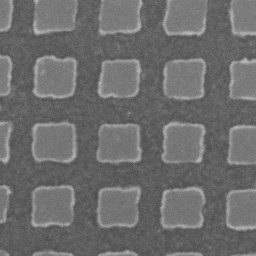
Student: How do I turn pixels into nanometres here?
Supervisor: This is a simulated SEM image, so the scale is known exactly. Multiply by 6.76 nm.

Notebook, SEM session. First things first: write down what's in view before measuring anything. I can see a regular array of raised bodies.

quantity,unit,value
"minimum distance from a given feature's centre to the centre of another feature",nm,432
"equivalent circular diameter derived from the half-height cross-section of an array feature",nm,301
